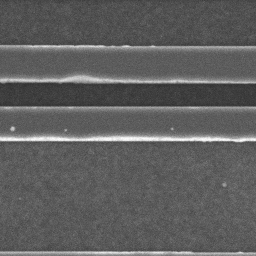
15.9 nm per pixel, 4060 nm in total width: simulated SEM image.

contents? lines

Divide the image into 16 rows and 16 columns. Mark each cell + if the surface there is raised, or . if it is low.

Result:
................
................
................
++++++++++++++++
++++++++++++++++
................
................
++++++++++++++++
++++++++++++++++
................
................
................
................
................
................
................